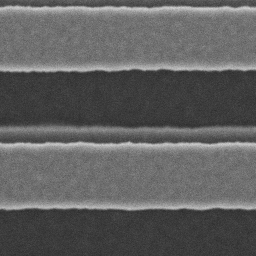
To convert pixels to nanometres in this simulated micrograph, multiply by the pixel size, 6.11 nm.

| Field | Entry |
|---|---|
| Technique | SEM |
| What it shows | lines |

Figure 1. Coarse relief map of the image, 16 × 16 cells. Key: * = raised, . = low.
****************
****************
****************
****************
................
................
................
................
****************
****************
****************
****************
****************
................
................
................